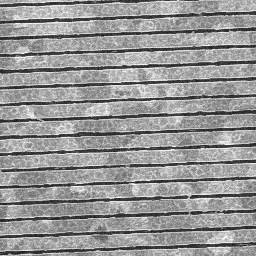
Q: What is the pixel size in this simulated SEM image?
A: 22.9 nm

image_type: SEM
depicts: parallel lines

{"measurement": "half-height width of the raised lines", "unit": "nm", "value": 280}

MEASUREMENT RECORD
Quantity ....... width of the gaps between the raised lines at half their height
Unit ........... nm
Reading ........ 94.2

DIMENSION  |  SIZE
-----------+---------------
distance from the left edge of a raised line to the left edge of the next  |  377 nm